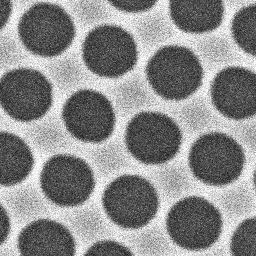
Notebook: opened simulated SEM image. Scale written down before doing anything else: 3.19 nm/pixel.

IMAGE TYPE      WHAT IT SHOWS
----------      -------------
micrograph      a regular array of holes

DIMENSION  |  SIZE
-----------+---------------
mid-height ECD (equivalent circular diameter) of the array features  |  177 nanometers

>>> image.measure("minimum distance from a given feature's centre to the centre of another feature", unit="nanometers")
214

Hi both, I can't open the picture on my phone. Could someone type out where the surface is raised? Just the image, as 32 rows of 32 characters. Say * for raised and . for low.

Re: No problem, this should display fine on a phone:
..**...*******.....**.......****
.**.....********..***.......**..
.*.......*************......*...
**.......***...*******.....**...
**.......**.....*************...
***......*.......*************..
****....**.......**.....*******.
**********.......**......*******
***.*******......*.......***..**
......******...***.......**.....
......*************......*......
.......***..*******.....**......
.......*......*******..***......
......**......*************.....
*....***......***....*******....
********......**......**********
.********.....**.......*********
...*******...***.......*.....***
....************.......*......**
....***..********.....**.......*
....**.....*******..****.......*
....*.......************......**
...**.......**....*******....***
*****.......*......*************
******.....**.......************
*******...***.......**.....*****
.************.......*......*****
.****..*******.....**.......***.
.**.....*******..****.......**..
.*.......************......**...
**.......***...*******.....**...
**.......**.....*************...